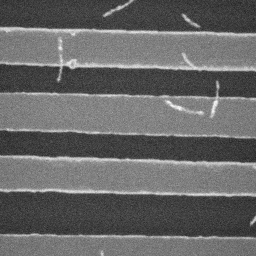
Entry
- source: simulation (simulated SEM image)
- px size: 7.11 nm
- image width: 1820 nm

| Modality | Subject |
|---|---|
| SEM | lines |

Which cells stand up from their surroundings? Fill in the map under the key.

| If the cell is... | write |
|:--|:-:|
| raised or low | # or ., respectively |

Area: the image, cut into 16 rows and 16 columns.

................
................
################
################
................
................
################
################
.............###
................
################
################
................
................
................
################